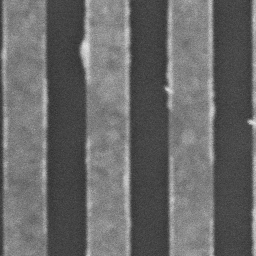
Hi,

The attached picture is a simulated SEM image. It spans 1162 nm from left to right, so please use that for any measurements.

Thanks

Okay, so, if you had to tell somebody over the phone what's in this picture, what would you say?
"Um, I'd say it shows one or a few lines or trenches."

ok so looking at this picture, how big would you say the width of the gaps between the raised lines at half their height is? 182 nm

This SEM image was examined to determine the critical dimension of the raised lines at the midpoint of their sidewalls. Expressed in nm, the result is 194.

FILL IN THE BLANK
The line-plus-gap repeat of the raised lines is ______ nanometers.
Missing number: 377